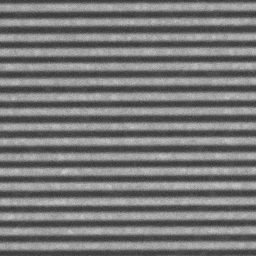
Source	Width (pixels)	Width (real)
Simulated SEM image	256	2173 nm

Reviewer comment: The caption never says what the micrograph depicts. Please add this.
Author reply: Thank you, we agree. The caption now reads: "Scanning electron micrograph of parallel lines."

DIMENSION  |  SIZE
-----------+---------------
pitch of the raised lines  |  127 nanometers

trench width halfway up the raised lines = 0.0679 micrometres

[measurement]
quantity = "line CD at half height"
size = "0.0605 µm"